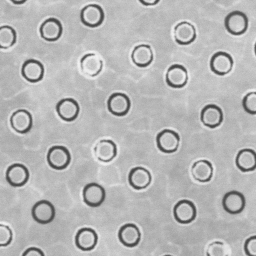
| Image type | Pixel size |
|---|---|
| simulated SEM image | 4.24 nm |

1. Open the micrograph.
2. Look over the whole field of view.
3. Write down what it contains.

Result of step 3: a regular array of ring-shaped grooves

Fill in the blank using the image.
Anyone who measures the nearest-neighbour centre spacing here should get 0.191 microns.